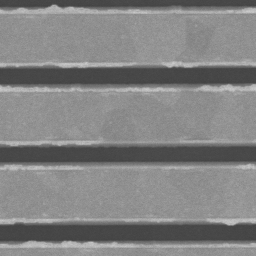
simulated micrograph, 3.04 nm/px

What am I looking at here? one or a few lines or trenches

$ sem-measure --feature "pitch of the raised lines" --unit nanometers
237